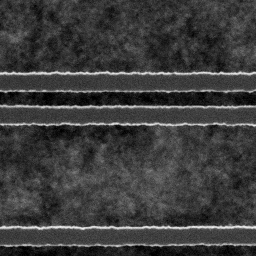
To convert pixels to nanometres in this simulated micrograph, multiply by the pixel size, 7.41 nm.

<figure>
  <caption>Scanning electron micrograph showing lines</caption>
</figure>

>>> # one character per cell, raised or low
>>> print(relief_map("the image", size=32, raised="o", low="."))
................................
................................
................................
................................
................................
................................
................................
................................
................................
oooooooooooooooooooooooooooooooo
oooooooooooooooooooooooooooooooo
o........ooo....oo..oo......o...
................................
oooooooooooooooooooooooooooooooo
oooooooooooooooooooooooooooooooo
ooooooooooo....ooooooooooo.ooooo
................................
................................
................................
................................
................................
................................
................................
................................
................................
................................
................................
................................
oooooooooo.ooooooooooooooooooooo
oooooooooooooooooooooooooooooooo
oooooooooooooooooooooooooooooooo
................................